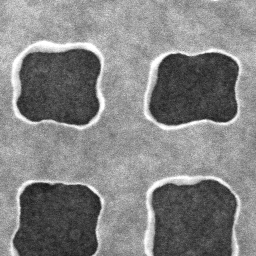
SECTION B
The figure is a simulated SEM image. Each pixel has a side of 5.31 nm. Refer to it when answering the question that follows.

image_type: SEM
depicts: holes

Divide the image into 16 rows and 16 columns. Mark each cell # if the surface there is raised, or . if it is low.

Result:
################
################
################
#.....####....##
#.....####.....#
#.....###......#
#.....###......#
##....####..#.##
################
################
################
##..######....##
#.....###......#
#.....###......#
#.....###......#
#.....###......#